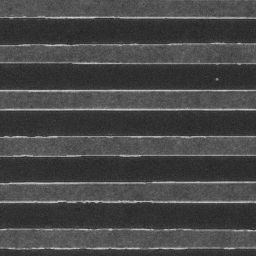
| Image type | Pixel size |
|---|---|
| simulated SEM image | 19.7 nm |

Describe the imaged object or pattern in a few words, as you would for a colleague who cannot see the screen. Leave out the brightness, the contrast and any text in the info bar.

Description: lines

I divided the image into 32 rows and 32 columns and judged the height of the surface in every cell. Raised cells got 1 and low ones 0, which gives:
11111111111111111111111111111111
11111111111111111111111111111111
00000000000000000000000000000000
00000000000000000000000000000000
00000000000000000000000000000000
00000000000000000000000000110000
11111111111111111111111111111111
11111111111111111111111111111111
00000000000000000000000000000000
00000000000000000000000000000000
00000000000000000000000000000000
11111111111111111111111111111111
11111111111111111111111111111111
11111111111111111111111111111111
00000000000000000000000000000000
00000000000000000000000000000000
00000000000000000000000000000000
11111111111111111111111111111111
11111111111111111111111111111111
00000000000000000000000000000000
00000000000000000000000000000000
00000000000000000000000000000000
00000000000000000000000000000000
11111111111111111111111111111111
11111111111111111111111111111111
00000000000000000000000000000000
00000000000000000000000000000000
00000000000000000000000000000000
00000000000000000000000000000000
11111111111111111111111111111111
11111111111111111111111111111111
00000000000000000000000000000000